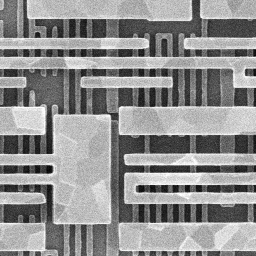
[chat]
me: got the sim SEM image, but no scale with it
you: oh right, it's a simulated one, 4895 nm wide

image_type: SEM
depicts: wiring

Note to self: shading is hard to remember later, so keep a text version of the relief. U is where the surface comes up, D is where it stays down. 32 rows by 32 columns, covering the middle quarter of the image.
UUUUUUUUUUUUUUUUUUUUUUUUUUUUUUUU
DDDDDDDDDDDDDDDDDDDDDDDDDDDDDDDD
DDDDDDDDDDDDDDDDDDDDDDDDDDDDDDDD
DDDDUUUUUUUUUUUUUUUUUUUUUUUDDDDD
DDDDUUUUUUUUUUUUUUUUUUUUUUUDDDDD
DDDDUUUUUUUUUUUUUUUUUUUUUUUDDDDD
DDDDDDDDDDDDDDDDDDDDDDDDDDDDDDDD
DDDDDDDDDDDDDDDDDDDDDDDDDDDDDDDD
DDDDDDDDDDDDDDDDDDDDDDDDDDDDDDDD
DDDDDDDDDDDDDDDDDDDDDDDDDDDDDDDD
DDDDDDDDDDDDDDDDDDDDDDDDDDDDDDDD
DDDDDDDDDDDDDDUUUUUUUUUUUUUUUUUU
DDDDDDDDDDDDDDUUUUUUUUUUUUUUUUUU
UUUUUUUUUUUDDDUUUUUUUUUUUUUUUUUU
UUUUUUUUUUUDDDUUUUUUUUUUUUUUUUUU
UUUUUUUUUUUDDDUUUUUUUUUUUUUUUUUU
UUUUUUUUUUUDDDUUUUUUUUUUUUUUUUUU
UUUUUUUUUUUDDDDDUUUDDDDDDDDDDDDD
UUUUUUUUUUUDDDDDDDDDDDDDDDDDDDDD
UUUUUUUUUUUDDDDDDDDDDDDDDDDDDDDD
UUUUUUUUUUUDDDDDDDDDDDDDDDDDDDDD
UUUUUUUUUUUDDDDDDDDDDDDDDDDDDDDD
UUUUUUUUUUUDDDDDDDDDDDDDDDDDDDDD
UUUUUUUUUUUDDDDUUUUUUUUUUUUUUUUU
UUUUUUUUUUUDDDDUUUUUUUUUUUUUUUUU
UUUUUUUUUUUDDDDDDDDDDDDDDDDDDDDD
UUUUUUUUUUUDDDDDDDDDDDDDDDDDDDDD
UUUUUUUUUUUDDDDDUUUUUUUUUUUUUUUU
UUUUUUUUUUUDDDDUUUUUUUUUUUUUUUUU
UUUUUUUUUUUDDDDUUUUUUUUUUUUUUUUU
UUUUUUUUUUUDDDDUUUDDDDDDDDDDDDDD
UUUUUUUUUUUDDDDUUUDDDDDDDDDDDDDD